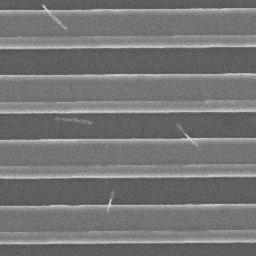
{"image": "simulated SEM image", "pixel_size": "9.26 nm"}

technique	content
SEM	lines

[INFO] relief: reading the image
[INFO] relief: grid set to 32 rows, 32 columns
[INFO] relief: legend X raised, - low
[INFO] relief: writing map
--------------------------------
XXXXXXXXXXXXXXXXXXXXXXXXXXXXXXXX
XXXXXXXXXXXXXXXXXXXXXXXXXXXXXXXX
XXXXXXXXXXXXXXXXXXXXXXXXXXXXXXXX
XXXXXXXXXXXXXXXXXXXXXXXXXXXXXXXX
XXXXXXXXXXXXXXXXXXXXXXXXXXXXXXXX
--------------------------------
--------------------------------
--------------------------------
XXXXXXXXXXXXXXXXXXXXXXXXXXXXXXXX
XXXXXXXXXXXXXXXXXXXXXXXXXXXXXXXX
XXXXXXXXXXXXXXXXXXXXXXXXXXXXXXXX
XXXXXXXXXXXXXXXXXXXXXXXXXXXXXXXX
XXXXXXXXXXXXXXXXXXXXXXXXXXXXXXXX
--------------------------------
--------------------------------
--------------------------------
------XX-XXXXXXXXXXXXXXXXXXXXXXX
XXXXXXXXXXXXXXXXXXXXXXXXXXXXXXXX
XXXXXXXXXXXXXXXXXXXXXXXXXXXXXXXX
XXXXXXXXXXXXXXXXXXXXXXXXXXXXXXXX
XXXXXXXXXXXXXXXXXXXXXXXXXXXXXXXX
--------------------------------
--------------------------------
--------------------------------
--------------------------------
XXXXXXXXXXXXXXXXXXXXXXXXXXXXXXXX
XXXXXXXXXXXXXXXXXXXXXXXXXXXXXXXX
XXXXXXXXXXXXXXXXXXXXXXXXXXXXXXXX
XXXXXXXXXXXXXXXXXXXXXXXXXXXXXXXX
--------------------------------
--------------------------------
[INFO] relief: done